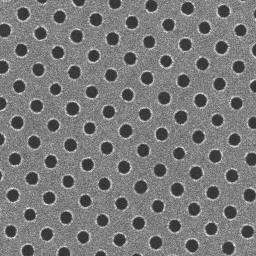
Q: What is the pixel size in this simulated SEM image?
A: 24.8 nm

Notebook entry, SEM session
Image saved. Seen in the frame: a regular array of holes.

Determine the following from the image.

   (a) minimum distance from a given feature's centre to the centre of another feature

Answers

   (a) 0.628 microns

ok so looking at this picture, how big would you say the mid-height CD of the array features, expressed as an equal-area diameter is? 322 nm